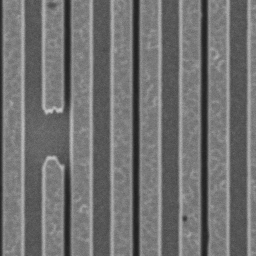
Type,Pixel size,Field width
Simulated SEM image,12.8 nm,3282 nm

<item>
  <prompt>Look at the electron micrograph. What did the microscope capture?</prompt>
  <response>parallel lines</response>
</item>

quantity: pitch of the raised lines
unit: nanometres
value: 438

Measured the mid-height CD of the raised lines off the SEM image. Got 21 pixels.